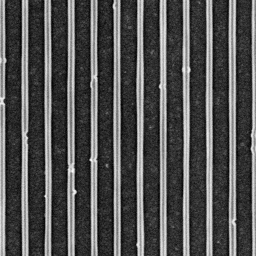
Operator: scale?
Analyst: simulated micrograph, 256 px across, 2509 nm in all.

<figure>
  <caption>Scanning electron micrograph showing parallel lines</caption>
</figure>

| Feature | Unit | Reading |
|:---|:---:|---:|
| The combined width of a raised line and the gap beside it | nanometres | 226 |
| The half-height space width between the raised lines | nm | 176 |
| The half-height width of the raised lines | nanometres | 52.7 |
